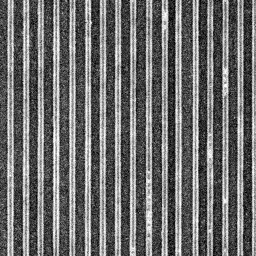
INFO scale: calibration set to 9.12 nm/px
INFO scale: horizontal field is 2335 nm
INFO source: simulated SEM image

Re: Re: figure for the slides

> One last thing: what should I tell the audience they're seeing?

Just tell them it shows parallel lines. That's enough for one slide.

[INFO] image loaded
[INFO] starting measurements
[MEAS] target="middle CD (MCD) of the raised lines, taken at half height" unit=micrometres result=0.0433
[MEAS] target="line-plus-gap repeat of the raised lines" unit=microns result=0.14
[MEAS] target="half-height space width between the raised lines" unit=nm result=94.6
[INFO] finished